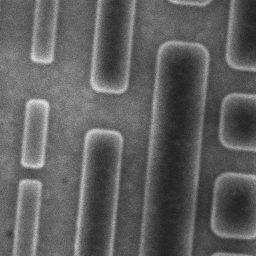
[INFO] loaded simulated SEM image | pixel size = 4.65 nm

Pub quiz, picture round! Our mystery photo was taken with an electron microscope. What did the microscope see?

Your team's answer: one or a few lines or trenches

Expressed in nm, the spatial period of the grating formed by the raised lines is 325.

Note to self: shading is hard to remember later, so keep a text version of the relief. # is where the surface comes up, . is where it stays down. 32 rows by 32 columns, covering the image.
.....##.....#####......###...###
....###.....#####............###
....###.....#####............###
....###.....#####............###
....###.....####.............###
....###.....####.....####....###
....###.....####....######..####
....##......####....######..####
............####....######...###
...........#####....######......
............####...#######......
..............#....#######......
...................#######..####
...###.............#######..####
...###.............######...####
...###.............######...####
...###.....###.....######...####
...###.....####....######...####
...###.....####....######....###
...##......####....######.......
...##.....#####....######.......
..........#####...#######.......
...#......#####...#######..#####
..###.....#####...#######..#####
..###.....#####...#######..#####
..###.....#####...######...#####
..###.....#####...######...#####
..###.....####....######...#####
..###.....####....######...#####
..###.....####....######....####
..##.....#####....######........
..##.....#####...#######........